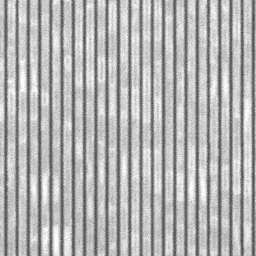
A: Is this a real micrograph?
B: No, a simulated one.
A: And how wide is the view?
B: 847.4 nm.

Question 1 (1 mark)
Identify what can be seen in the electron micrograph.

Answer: parallel lines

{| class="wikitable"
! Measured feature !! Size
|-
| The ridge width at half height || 26.5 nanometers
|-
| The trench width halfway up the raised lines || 11.6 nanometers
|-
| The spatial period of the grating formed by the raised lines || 0.0373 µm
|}